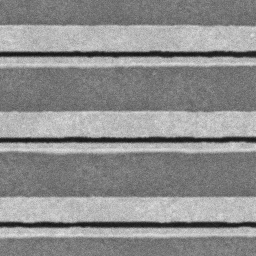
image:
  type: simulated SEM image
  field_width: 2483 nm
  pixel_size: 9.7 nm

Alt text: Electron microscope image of lines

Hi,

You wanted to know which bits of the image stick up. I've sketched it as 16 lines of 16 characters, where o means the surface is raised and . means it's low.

................
................
oooooooooooooooo
oooooooooooooooo
................
................
................
oooooooooooooooo
oooooooooooooooo
................
................
................
oooooooooooooooo
oooooooooooooooo
oooooooooooooooo
................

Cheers